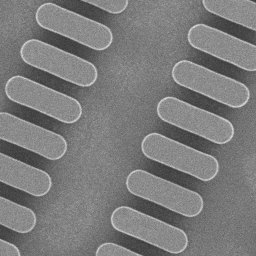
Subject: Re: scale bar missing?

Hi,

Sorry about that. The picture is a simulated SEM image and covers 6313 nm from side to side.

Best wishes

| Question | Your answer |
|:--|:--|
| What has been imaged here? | groups of lines, slits or small figures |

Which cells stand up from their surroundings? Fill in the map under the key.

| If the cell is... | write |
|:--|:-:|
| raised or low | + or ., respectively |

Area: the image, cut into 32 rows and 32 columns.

......+.....++++..........++++++
.....++++.....+...........++++++
.....++++++..................+++
......+++++++...........+++....+
........++++++..........+++++...
...+++....++++..........+++++++.
...+++++..................++++++
...++++++++.................++++
.....+++++++..........++++....++
.......+++++..........++++++....
.++++....++...........++++++++..
.++++++..................++++++.
..+++++++...........+++....++++.
....++++++..........+++++.......
++....++++..........+++++++.....
++++..................+++++++...
+++++++.................+++++...
.+++++++..........++++....+++...
...+++++..........++++++........
+.....++..........+++++++++.....
+++..................++++++.....
++++++...........+.....++++.....
++++++..........+++++....+......
..++++..........+++++++.........
.................++++++++.......
++..................+++++.......
++++..........+++.....+++.......
++++..........++++++............
.+++..........++++++++..........
................+++++++.........
+............+.....++++.........
++..........+++++....+..........